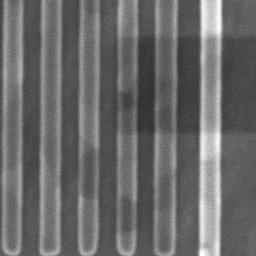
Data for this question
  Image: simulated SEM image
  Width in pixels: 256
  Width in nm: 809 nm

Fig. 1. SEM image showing wiring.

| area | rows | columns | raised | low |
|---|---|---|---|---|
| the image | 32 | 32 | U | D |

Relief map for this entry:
DUUDDUUUDDUUDDDUUDDDUUDDDUUUDDDD
DUUDDUUUDDUUDDDUUDDDUUDDDUUUDDDD
DUUDDUUUDDUUDDDUUDDDUUDDDUUUDDDD
DUUDDUUUDDUUDDDUUDDDUUDDDUUUDDDD
DUUDDUUUDDUUDDDUUDDDUUDDDUUUDDDD
UUUDDUUUDDUUDDDUUDDDUUDDDUUUDDDD
UUUDDUUUDDUUDDDUUDDUUUDDDUUUDDDD
DUUDDUUUDDUUDDDUUDDUUUDDDUUDDDDD
UUUDDUUUDDUUDDDUUDDUUUDDDUUDDDDD
UUUDDUUUDDUUDDDUUDDUUUDDDUUDDDDD
UUUDDUUUDDUUDDDUUDDUUUDDDUUDDDDD
UUUDDUUUDDUUDDDUUDDUUUDDDUUDDDDD
UUUDDUUUDDUUDDDUUDDUUUDDDUUDDDDD
UUUDDUUUDDUUDDDUUDDUUUDDDUUDDDDD
UUUDDUUUDDUUDDDUUDDUUUDDDUUDDDDD
UUUDDUUUDDUUDDDUUDDUUUDDDUUDDDDD
UUUDDUUUDDUUDDDUUDDUUUDDDUUDDDDD
UUUDDUUUDDUUDDDUUDDUUUDDDUUDDDDD
UUUDDUUUDDUUDDDUUDDUUUDDDUUDDDDD
UUUDDUUUDDUUDDDUUDDUUUDDDUUDDDDD
UUUDDUUUDDUUDDDUUDDUUUDDDUUDDDDD
UUUDDUUDDDUUDDDUUDDUUUDDDUUDDDDD
UUUDDUUDDDUUDDDUUDDUUUDDDUUDDDDD
UUUDDUUDDDUUDDDUUDDUUUDDDUUDDDDD
UUUDDUUDDDUUDDDUUDDUUUDDDUUDDDDD
UUUDDUUDDDUUDDDUUDDUUUDDDUUDDDDD
UUUDDUUDDDUUDDDUUDDUUUDDDUUDDDDD
UUUDDUUDDDUUDDDUUDDUUUDDDUUDDDDD
UUUDDUUDDDUUDDDUUDDUUUDDDUUDDDDD
UUUDDUUDDDUUDDDUUDDUUUDDDUUDDDDD
UUUDDUUDDDUUDDDUUDDUUUDDDUUDDDDD
DUDDDUUDDDUUDDDUUDDUUUDDDUUDDDDD